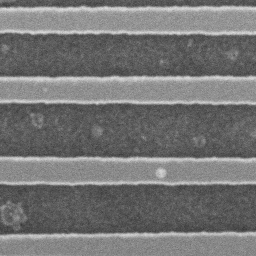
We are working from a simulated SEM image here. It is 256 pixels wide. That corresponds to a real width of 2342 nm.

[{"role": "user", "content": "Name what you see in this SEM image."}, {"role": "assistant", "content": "lines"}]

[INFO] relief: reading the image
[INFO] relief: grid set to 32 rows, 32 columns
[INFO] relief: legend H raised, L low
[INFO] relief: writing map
LLLLLLLLLLLLLLLLLLLLLLLLLLLLLLLL
HHHHHHHHHHHHHHHHHHHHHHHHHHHHHHHH
HHHHHHHHHHHHHHHHHHHHHHHHHHHHHHHH
HHHHHHHHHHHHHHHHHHHHHHHHHHHHHHHH
LLLLLLLLLLLLLLLLLLLLLLLLLLLLLLLL
LLLLLLLLLLLLLLLLLLLLLLLLLLLLLLLL
LLLLLLLLLLLLLLLLLLLLLLLLLLLLLLLL
LLLLLLLLLLLLLLLLLLLLLLLLLLLLLLLL
LLLLLLLLLLLLLLLLLLLLLLLLLLLLLLLL
LLLLLLLLLLLLLLLLLLLLLLLLLLLLLLLL
HHHHHHHHHHHHHHHHHHHHHHHHHHHHHHHH
HHHHHHHHHHHHHHHHHHHHHHHHHHHHHHHH
HHHHHHHHHHHHHHHHHHHHHHHHHHHHHHHH
LLLLLLLLLLLLLLLLLLLLLLLLLLLLLLLL
LLLLLLLLLLLLLLLLLLLLLLLLLLLLLLLL
LLLLLLLLLLLLLLLLLLLLLLLLLLLLLLLL
LLLLLLLLLLLLLLLLLLLLLLLLLLLLLLLL
LLLLLLLLLLLLLLLLLLLLLLLLLLLLLLLL
LLLLLLLLLLLLLLLLLLLLLLLLLLLLLLLL
LLLLLLLLLLLLLLLLLLLLLLLLLLLLLLLL
HHHHHHHHHHHHHHHHHHHHHHHHHHHHHHHH
HHHHHHHHHHHHHHHHHHHHHHHHHHHHHHHH
HHHHHHHHHHHHHHHHHHHHHHHHHHHHHHHH
LLLLLLLLLLLLLLLLLLLLLLLLLLLLLLLL
LLLLLLLLLLLLLLLLLLLLLLLLLLLLLLLL
LLLLLLLLLLLLLLLLLLLLLLLLLLLLLLLL
LLLLLLLLLLLLLLLLLLLLLLLLLLLLLLLL
LLLLLLLLLLLLLLLLLLLLLLLLLLLLLLLL
LLLLLLLLLLLLLLLLLLLLLLLLLLLLLLLL
HHHHHHHHHHHHHHHHHHHHHHHHHHHHHHHH
HHHHHHHHHHHHHHHHHHHHHHHHHHHHHHHH
HHHHHHHHHHHHHHHHHHHHHHHHHHHHHHHH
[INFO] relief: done